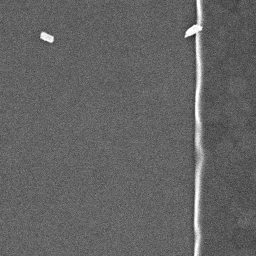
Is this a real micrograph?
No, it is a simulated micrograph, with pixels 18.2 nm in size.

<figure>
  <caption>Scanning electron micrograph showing wiring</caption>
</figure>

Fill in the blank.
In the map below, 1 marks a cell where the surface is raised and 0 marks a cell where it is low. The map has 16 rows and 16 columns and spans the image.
0000000000001111
0000000000001111
0000000000001111
0000000000001111
0000000000001111
0000000000001111
0000000000001111
0000000000001111
0000000000001111
0000000000001111
0000000000001111
0000000000001111
0000000000001111
0000000000001111
0000000000001111
0000000000001111